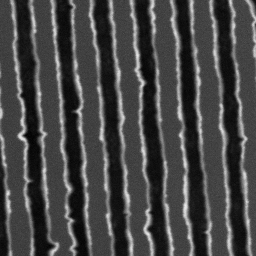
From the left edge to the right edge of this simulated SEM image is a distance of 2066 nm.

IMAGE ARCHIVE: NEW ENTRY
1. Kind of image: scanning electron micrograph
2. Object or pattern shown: parallel lines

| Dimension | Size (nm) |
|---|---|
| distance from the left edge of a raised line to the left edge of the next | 321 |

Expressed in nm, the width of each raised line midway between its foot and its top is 192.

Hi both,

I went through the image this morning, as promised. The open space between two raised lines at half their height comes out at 130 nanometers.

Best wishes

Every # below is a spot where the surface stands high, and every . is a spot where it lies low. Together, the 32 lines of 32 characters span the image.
##..###..###..###..###..##...##.
##..###..##...###..###..###..###
##..###..###..###..###..###..###
##..###..###..###..###..###..###
##..###..###..###..###..###..###
##..###..###..###..###..###..###
##..###..###..###..###..###..###
##...##..###..###..###..###..###
##...##..###..###...##..###..###
##...##..###...###..##...##...##
###..###..###..###..##...###..##
###..###..###..###..###..###.###
###..###..###..###..###..###..##
###..###..###..###..###..###..##
###..###..###..###..###..###..##
###..###..###..###..###..###..##
###..###..###..###..###..###..##
###..###..###..###..###..###..##
###..###..###..###..###..###..##
###..###..###..###..###..###..##
###..###..###..###..###..###..##
.##..###..###...##...##..###..##
.##..###..###...##...##...##..##
.##..####..##...###.###...##..##
.##...###..###..###..##...###..#
.###..##...###..###..##...###..#
.###..###..###..###..##...###..#
.###..###..###..###..###..###..#
.###..###..###..##...###..###..#
.###..###..###..###..###..###..#
.###...##..###..###..###..###..#
.###..###..###..###..###..###..#